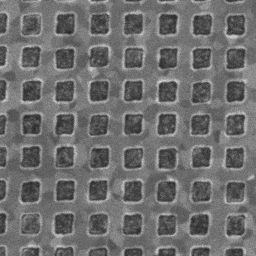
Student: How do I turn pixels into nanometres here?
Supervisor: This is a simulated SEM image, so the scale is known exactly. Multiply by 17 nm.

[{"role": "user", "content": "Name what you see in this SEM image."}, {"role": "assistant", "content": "a regular array of holes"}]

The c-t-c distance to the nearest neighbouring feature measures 557 nanometres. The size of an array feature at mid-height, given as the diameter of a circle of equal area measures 382 nanometres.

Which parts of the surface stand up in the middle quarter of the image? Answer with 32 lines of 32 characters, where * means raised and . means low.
...****....****.....****....****
********************************
********************************
********************************
...****....****.....****....****
...***.....****.....***.....****
...***.....****.....***.....****
...***.....****.....***.....****
..****.....****.....***.....****
*******...*****...******...*****
********************************
********************************
..**************...*****....****
...***.....****.....***.....****
...***.....****.....***.....****
...***.....****.....***.....****
..****.....****.....***.....***.
..****.....****....****....*****
********************************
********************************
..******************************
...****....****.....****....****
...***.....****...*.***.....****
...***.....****.....***.....****
...***.....****.....***.....****
..****.....****.....***.....****
************************.*******
********************************
********************************
...***.....****.....****....****
...***.....****.....***.....****
...***.....****.....***.....****